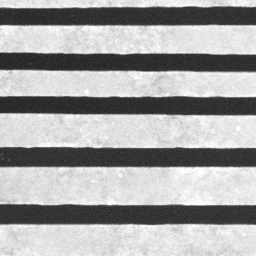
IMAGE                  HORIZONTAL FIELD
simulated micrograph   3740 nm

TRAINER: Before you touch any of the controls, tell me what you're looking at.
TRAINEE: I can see lines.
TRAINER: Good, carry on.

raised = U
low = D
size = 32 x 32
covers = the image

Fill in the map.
UUUUUUUUUUUUUUUUUUUUUUUUUUUUUUUU
DDDDDDDDDDDDDDDDDDDDDDDDDDDDDDDD
DDDDDDDDDDDDDDDDDDDDDDDDDDDDDDDD
UUUUUUUUUUUUUUUUUUUUUUUUUUUUUUUU
UUUUUUUUUUUUUUUUUUUUUUUUUUUUUUUU
UUUUUUUUUUUUUUUUUUUUUUUUUUUUUUUU
UUUUUUUUUUUUUUUUUUUUUUUUUUUUUUUU
DDDDDDDDDDDDDDDDDDDDDDDDDDDDDDDD
DDDDDDDDDDDDDDDDDDDDDDDDDDDDDDDD
UUUUUUUUUUUUUUUUUUUUUUUUUUUUUUUU
UUUUUUUUUUUUUUUUUUUUUUUUUUUUUUUU
UUUUUUUUUUUUUUUUUUUUUUUUUUUUUUUU
DDDDDDDDDDDDDDDDDDDDDDDDDDDDDDDD
DDDDDDDDDDDDDDDDDDDDDDDDDDDDDDDD
UUUUUUUUUUUUUUUUUUUUUUUUUUUUUUUU
UUUUUUUUUUUUUUUUUUUUUUUUUUUUUUUU
UUUUUUUUUUUUUUUUUUUUUUUUUUUUUUUU
UUUUUUUUUUUUUUUUUUUUUUUUUUUUUUUU
DDDDDDDDDDDDDDDDDDDDDDDDDDDUDDDD
DDDDDDDDDDDDDDDDDDDDDDDDDDDDDDDD
DDDDDDDDDDDDDDDDDDDDDDDDDDDDDDDD
UUUUUUUUUUUUUUUUUUUUUUUUUUUUUUUU
UUUUUUUUUUUUUUUUUUUUUUUUUUUUUUUU
UUUUUUUUUUUUUUUUUUUUUUUUUUUUUUUU
UUUUUUUUUUUUUUUUUUUUUUUUUUUUUUUU
DDDDUUUUDUUUUUUUUUUUUUUUUUUUUUUU
DDDDDDDDDDDDDDDDDDDDDDDDDDDDDDDD
DDDDDDDDDDDDDDDDDDDDDDDDDDDDDDDD
UUUUUUUUUUUUUUUUUUUUUUUUUUUUUUUU
UUUUUUUUUUUUUUUUUUUUUUUUUUUUUUUU
UUUUUUUUUUUUUUUUUUUUUUUUUUUUUUUU
UUUUUUUUUUUUUUUUUUUUUUUUUUUUUUUU